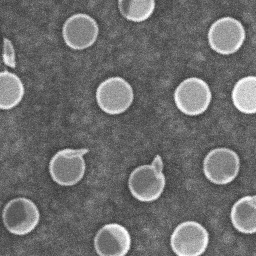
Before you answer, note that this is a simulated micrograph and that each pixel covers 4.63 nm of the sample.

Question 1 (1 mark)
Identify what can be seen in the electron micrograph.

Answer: a regular array of raised bodies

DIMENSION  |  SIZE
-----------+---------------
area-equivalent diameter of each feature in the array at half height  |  160 nm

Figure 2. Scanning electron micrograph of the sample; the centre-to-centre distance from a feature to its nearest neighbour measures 329 nm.